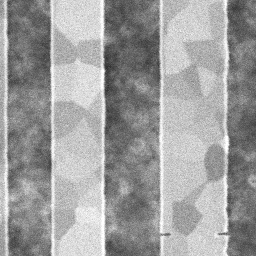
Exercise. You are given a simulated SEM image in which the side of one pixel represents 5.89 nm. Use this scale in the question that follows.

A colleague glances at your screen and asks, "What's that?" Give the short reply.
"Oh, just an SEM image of one or a few lines or trenches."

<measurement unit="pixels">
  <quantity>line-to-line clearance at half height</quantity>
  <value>51.7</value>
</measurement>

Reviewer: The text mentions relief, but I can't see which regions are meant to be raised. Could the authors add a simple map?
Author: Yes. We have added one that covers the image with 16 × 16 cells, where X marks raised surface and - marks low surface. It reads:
---XXX----XXXX--
---XXX----XXXX--
---XXX----XXXX--
---XXX----XXXX--
---XXX----XXXX--
---XXX----XXXX--
---XXX----XXXX--
---XXX----XXXX--
---XXX----XXXX--
---XXX----XXXX--
---XXX----XXXX--
---XXX----XXXX--
---XXX----XXXX--
---XXX----XXXX--
---XXX----XXXX--
---XXX----XXXX--